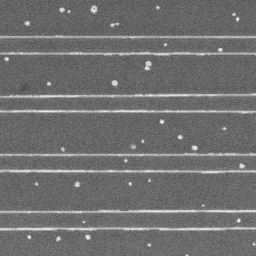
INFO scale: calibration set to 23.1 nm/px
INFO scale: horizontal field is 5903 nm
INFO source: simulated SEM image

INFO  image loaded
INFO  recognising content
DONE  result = lines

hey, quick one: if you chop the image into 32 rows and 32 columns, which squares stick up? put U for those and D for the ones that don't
DDDDDDDDDDDDDDDDDDDDDDDDDDDDDDDD
DDDDDDDDDDDDDDDDDDDDDDDDDDDDDDDD
DDDDDDDDDDDDDDDDDDDDDDDDDDDDDDDD
DDDDDDDDDDDDDDDDDDDDDDDDDDDDDDDD
DDDDDDDDDDDDDDDDDDDDDDDDDDDDDDDD
UUUUUUUUUUUUUUUUUUUUUUUUUUUUUUUU
UUUUUUUUUUUUUUUUUUUUUUUUUUUUUUUU
DDDDDDDDDDDDDDDDDDDDDDDDDDDDDDDD
DDDDDDDDDDDDDDDDDDDDDDDDDDDDDDDD
DDDDDDDDDDDDDDDDDDDDDDDDDDDDDDDD
DDDDDDDDDDDDDDDDDDDDDDDDDDDDDDDD
DDDDDDDDDDDDDDDDDDDDDDDDDDDDDDDD
UUUUUUUUUUUUUUUUUUUUUUUUUUUUUUUU
UUUUUUUUUUUUUUUUUUUUUUUUUUUUUUUU
DDDDDDDDDDDDDDDDDDDDDDDDDDDDDDDD
DDDDDDDDDDDDDDDDDDDDDDDDDDDDDDDD
DDDDDDDDDDDDDDDDDDDDDDDDDDDDDDDD
DDDDDDDDDDDDDDDDDDDDDDDDDDDDDDDD
DDDDDDDDDDDDDDDDDDDDDDDDDDDDDDDD
UUUUUUUUUUUUUUUUUUUUUUUUUUUUUUUU
UUUUUUUUUUUUUUUUUUUUUUUUUUUUUUUU
DDDDDDDDDDDDDDDDDDDDDDDDDUDDDDDD
DDDDDDDDDDDDDDDDDDDDDDDDDDDDDDDD
DDDDDDDDDDDDDDDDDDDDDDDDDDDDDDDD
DDDDDDDDDDDDDDDDDDDDDDDDDDDDDDDD
DDDDDDDDDDDDDDDDDDDDDDDDDDDDDDDD
UUUUUUUUUUUUUUUUUUUUUUUUUUUUUUUU
UUUUUUUUUUUUUUUUUUUUUUUUUUUUUUUU
UUUUUUUUUUUUUUUUUUUUUUUUUUUUUUUU
DDDDDDDDDDDDDDDDDDDDDDDDDDDDDDDD
DDDDDDDDDDDDDDDDDDDDDDDDDDDDDDDD
DDDDDDDDDDDDDDDDDDDDDDDDDDDDDDDD